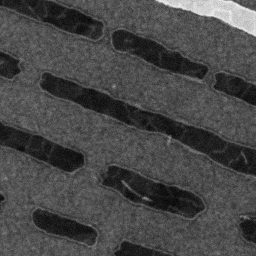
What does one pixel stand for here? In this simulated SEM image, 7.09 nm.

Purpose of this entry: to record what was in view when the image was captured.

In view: one or a few lines or trenches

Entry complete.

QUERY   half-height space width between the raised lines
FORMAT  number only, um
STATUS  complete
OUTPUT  0.304